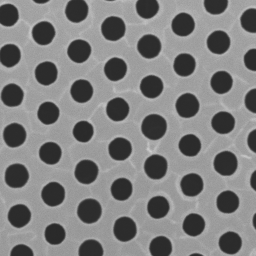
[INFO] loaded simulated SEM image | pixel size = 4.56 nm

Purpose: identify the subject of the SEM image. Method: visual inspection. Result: a regular array of holes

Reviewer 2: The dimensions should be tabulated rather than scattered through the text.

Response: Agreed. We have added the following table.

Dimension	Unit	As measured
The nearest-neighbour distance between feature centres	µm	0.181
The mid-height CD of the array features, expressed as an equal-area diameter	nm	104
